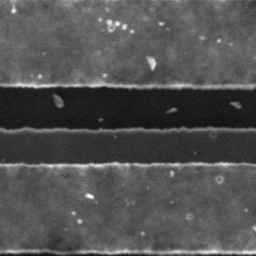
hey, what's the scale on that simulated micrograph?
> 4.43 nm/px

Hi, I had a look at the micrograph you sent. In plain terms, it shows lines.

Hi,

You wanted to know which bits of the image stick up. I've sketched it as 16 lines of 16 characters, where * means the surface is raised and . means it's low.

****************
****************
****************
****************
****************
................
................
................
................
................
****************
****************
****************
****************
****************
****************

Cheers